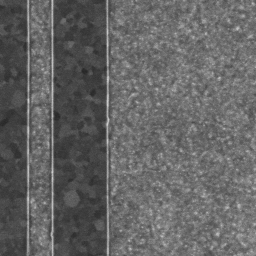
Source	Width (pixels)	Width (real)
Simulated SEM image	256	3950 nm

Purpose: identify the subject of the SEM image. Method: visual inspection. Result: one or a few lines or trenches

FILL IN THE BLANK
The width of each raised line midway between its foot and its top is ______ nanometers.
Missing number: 841